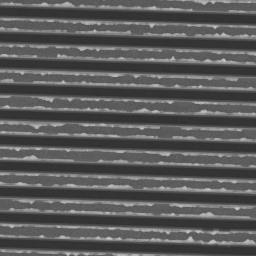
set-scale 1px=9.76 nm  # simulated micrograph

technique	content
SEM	parallel lines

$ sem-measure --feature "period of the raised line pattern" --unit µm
0.251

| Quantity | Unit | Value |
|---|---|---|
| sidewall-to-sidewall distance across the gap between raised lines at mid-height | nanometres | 106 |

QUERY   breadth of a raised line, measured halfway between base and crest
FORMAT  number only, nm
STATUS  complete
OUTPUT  148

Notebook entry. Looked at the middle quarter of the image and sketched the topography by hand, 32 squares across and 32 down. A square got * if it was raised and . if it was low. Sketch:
................................
................................
*******************.............
********************************
********************************
.........***********************
................................
................................
**********......................
********************************
********************************
********************************
........................********
................................
*...............................
********************************
********************************
********************************
...............*****************
................................
................................
****************................
********************************
********************************
********************************
..............................**
................................
................................
********************************
********************************
********************************
.....................***********